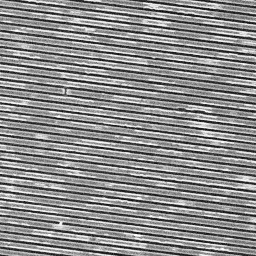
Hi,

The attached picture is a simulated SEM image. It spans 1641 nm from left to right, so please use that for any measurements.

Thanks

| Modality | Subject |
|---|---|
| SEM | parallel lines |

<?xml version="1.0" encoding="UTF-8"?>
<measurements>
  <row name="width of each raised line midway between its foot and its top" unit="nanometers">34.1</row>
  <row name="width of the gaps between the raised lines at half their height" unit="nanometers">17.5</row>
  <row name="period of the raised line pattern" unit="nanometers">51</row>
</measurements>